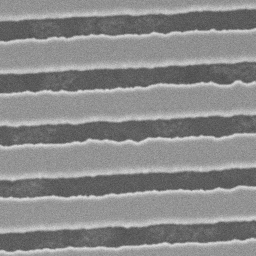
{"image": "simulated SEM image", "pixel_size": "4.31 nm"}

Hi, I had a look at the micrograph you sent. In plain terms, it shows lines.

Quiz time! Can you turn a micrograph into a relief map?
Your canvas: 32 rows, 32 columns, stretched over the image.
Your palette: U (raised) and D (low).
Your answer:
UUUUUUUUUUUUUUUUUUUUUUUUUUUUUUUU
UUUUUUUUUUUUUUUUUUUUUUUDDDDDDDDD
DDDDDDDDDDDDDDDDDDDDDDDDDDDDDDDD
DDDDDDDDDDDDDDDDDDDDDDDDDDDDDDDD
DDDDDDDDDDUUUUUUUUUUUUUUUUUUUUUU
UUUUUUUUUUUUUUUUUUUUUUUUUUUUUUUU
UUUUUUUUUUUUUUUUUUUUUUUUUUUUUUUU
UUUUUUUUUUUUUUUUUUUUUUUUUUUUUUUU
UUUUUUUUUUUUDDDDDDDDDDDDDDDDDDDD
DDDDDDDDDDDDDDDDDDDDDDDDDDDDDDDD
DDDDDDDDDDDDDDDDDDDDUDDDUUUDDUUU
DDDUDUUUUUUUUUUUUUUUUUUUUUUUUUUU
UUUUUUUUUUUUUUUUUUUUUUUUUUUUUUUU
UUUUUUUUUUUUUUUUUUUUUUUUUUUUUUUU
UUUUUUUUUUUUUUUUUUUUUUUUUDDDDDDD
UUUUUDDDDDDDDDDDDDDDDDDDDDDDDDDD
DDDDDDDDDDDDDDDDDDDDDDDDDDDDDDDD
DDDDDDDDDDDUDDDDDDUUUUUUUUUUUUUU
UUUUUUUUUUUUUUUUUUUUUUUUUUUUUUUU
UUUUUUUUUUUUUUUUUUUUUUUUUUUUUUUU
UUUUUUUUUUUUUUUUUUUUUUUUUUUUUUUU
UUUUUUUUUUUUUUUUUUDDDDDDDDDDDDDD
DDDDDDDDDDDDDDDDDDDDDDDDDDDDDDDD
DDDDDDDDDDDDDDDDDDDDDDDDDDDDDUUU
DDDDDDUDDUUUDUUUUUUUUUUUUUUUUUUU
UUUUUUUUUUUUUUUUUUUUUUUUUUUUUUUU
UUUUUUUUUUUUUUUUUUUUUUUUUUUUUUUU
UUUUUUUUUUUUUUUUUUUUUUUUUUUUUUUU
UUUUUUUUDDDDDDDDDDDDDDDDDDDDDDDD
DDDDDDDDDDDDDDDDDDDDDDDDDDDDDDDD
DDDDDDDDDDDDDDDDDDDUUUUUUUUUUUUU
UUUUUUUUUUUUUUUUUUUUUUUUUUUUUUUU